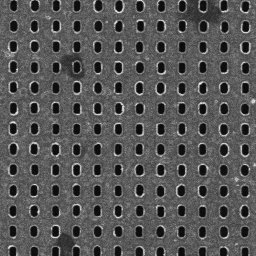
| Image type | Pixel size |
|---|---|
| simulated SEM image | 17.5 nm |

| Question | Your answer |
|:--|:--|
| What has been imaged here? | a regular array of holes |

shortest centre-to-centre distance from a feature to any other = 354 nm